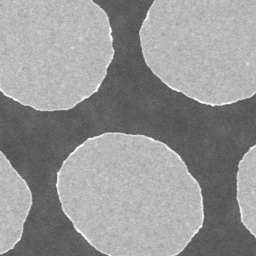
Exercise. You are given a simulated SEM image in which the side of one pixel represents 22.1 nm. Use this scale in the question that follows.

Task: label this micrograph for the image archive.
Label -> raised bodies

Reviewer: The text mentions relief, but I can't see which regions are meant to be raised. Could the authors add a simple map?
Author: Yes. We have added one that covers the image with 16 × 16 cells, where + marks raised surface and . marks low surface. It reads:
++++++...+++++++
+++++++..+++++++
+++++++..+++++++
+++++++..+++++++
+++++++...++++++
++++++.....+++++
.++++........+..
................
......+++.......
.....++++++.....
+...++++++++...+
++..++++++++...+
++..+++++++++..+
++..+++++++++..+
+....+++++++....
+.....+++++.....